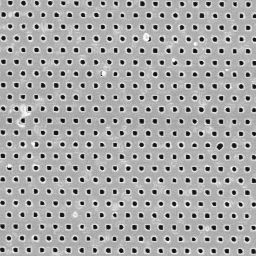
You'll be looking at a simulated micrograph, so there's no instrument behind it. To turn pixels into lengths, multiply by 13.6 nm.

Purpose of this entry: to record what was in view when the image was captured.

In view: a regular array of holes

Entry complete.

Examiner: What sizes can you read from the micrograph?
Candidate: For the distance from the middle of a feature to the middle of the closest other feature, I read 177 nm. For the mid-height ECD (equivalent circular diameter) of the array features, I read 61.3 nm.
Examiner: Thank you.